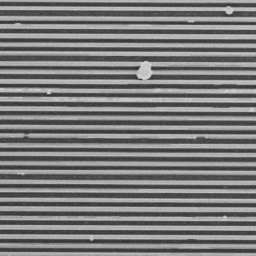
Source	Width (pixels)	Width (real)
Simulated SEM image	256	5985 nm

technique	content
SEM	parallel lines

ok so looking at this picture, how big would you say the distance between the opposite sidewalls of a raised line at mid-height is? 87.7 nm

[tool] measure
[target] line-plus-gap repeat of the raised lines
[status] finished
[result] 0.213 um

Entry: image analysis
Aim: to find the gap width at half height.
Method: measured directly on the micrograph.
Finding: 129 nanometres